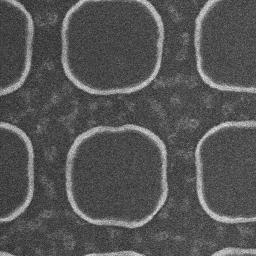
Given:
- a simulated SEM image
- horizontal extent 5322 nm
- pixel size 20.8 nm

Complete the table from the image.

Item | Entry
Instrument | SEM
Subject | raised bodies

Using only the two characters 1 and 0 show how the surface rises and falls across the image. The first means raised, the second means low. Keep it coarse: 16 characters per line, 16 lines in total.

1000011110000111
1100111111001111
1100111111001111
1100111111001111
1100111111000111
1000011100000011
0000000000000000
0000000000000000
1000011111000111
1100111111001111
1100111111001111
1100111111001111
1100111111000111
1000011111000111
0000000000000000
0000000000000000